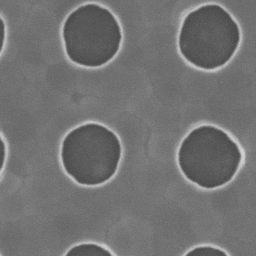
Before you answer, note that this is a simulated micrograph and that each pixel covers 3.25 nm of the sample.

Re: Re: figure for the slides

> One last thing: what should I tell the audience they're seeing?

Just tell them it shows holes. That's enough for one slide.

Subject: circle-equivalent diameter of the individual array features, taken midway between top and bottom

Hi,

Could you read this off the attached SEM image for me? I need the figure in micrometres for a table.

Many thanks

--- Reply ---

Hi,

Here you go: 0.201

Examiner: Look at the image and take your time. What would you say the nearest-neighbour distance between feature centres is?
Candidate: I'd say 0.382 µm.